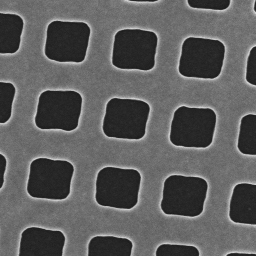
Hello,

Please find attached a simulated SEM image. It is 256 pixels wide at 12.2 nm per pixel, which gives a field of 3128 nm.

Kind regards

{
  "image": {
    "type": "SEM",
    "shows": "a regular array of holes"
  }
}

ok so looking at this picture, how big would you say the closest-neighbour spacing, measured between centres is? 826 nanometers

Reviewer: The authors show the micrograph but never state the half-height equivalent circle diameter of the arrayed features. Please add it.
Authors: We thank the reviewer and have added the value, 554 nanometers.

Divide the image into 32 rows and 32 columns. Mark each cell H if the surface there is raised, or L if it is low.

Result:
HHHHHHHHHHHHHHHHHHHHHHHHLLLLLHHH
HHHHHHHHHHHHHHHHHHHHHHHHHHHHHHHH
LLLHHHHHHHHHHHHHHHHHHHHHHHHHHHHH
LLLHHHLLLLLHHHHHHHHHHHHHHHHHHHHH
LLLHHHLLLLLHHHLLLLLLHHHHHHHHHHHH
LLHHHHLLLLLHHHLLLLLLHHHLLLLLHHHH
LLHHHHLLLLLHHHLLLLLHHHHLLLLLHHHL
HHHHHHHLLLHHHHLLLLLHHHLLLLLLHHHL
HHHHHHHHHHHHHHHLLLLHHHLLLLLLHHHL
HHHHHHHHHHHHHHHHHHHHHHHLLLLHHHHL
LHHHHHHHHHHHHHHHHHHHHHHHHHHHHHHL
LLHHHHLLLHHHHHHHHHHHHHHHHHHHHHHH
LLHHHLLLLLHHHHLLLHHHHHHHHHHHHHHH
LHHHHLLLLLHHHLLLLLLHHHLLLHHHHHHH
LHHHHLLLLLHHHLLLLLLHHHLLLLLHHHHL
HHHHHLLLLLHHHLLLLLHHHLLLLLLHHHLL
HHHHHHHHHHHHHLLLLLHHHLLLLLLHHHLL
HHHHHHHHHHHHHHHHHHHHHLLLLLLHHHLL
HHHHHHHHHHHHHHHHHHHHHHHHHHHHHHLL
HHHHHHHHHHHHHHHHHHHHHHHHHHHHHHHH
LHHHLLLLLHHHHHHHHHHHHHHHHHHHHHHH
LHHHLLLLLHHHLLLLLHHHHHHHHHHHHHHH
HHHHLLLLLHHHLLLLLLHHHLLLLLHHHHHH
HHHLLLLLLHHHLLLLLHHHLLLLLLHHHLLL
HHHHLLLLHHHHLLLLLHHHLLLLLLHHHLLL
HHHHHHHHHHHHLLLLLHHHLLLLLHHHHLLL
HHHHHHHHHHHHHHHHHHHHHLLLLHHHHLLL
HHHHHHHHHHHHHHHHHHHHHHHHHHHHHLLL
HHHHLHHHHHHHHHHHHHHHHHHHHHHHHHHH
HHHLLLLLHHHHHHHHHHHHHHHHHHHHHHHH
HHLLLLLLHHHLLLLLHHHHHHHHHHHHHHHH
HHLLLLLLHHHLLLLLHHHHLLLLLHHHHHHH